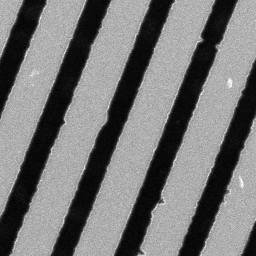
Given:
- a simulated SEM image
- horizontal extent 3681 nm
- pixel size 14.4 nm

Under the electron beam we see parallel lines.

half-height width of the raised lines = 23.4 pixels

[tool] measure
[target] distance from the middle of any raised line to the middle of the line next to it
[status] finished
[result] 0.851 um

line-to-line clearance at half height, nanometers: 515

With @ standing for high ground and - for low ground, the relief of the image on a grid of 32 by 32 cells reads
---@@@-----@@@-----@@@-----@@@--
--@@@-----@@@-----@@@-----@@@---
--@@@-----@@@-----@@@-----@@@---
-@@@@----@@@@----@@@-----@@@----
-@@@-----@@@-----@@@-----@@@----
-@@@-----@@@-----@@@-----@@@----
@@@-----@@@-----@@@-----@@@-----
@@@-----@@@-----@@@-----@@@-----
@@@----@@@@----@@@@----@@@@----@
@@-----@@@-----@@@-----@@@-----@
@@-----@@@-----@@@-----@@@-----@
@-----@@@-----@@@-----@@@-----@@
@-----@@@-----@@@-----@@@-----@@
@----@@@@----@@@@----@@@@----@@@
-----@@@-----@@@-----@@@-----@@@
-----@@@-----@@@-----@@@-----@@@
----@@@@----@@@-----@@@-----@@@-
----@@@-----@@@-----@@@-----@@@-
---@@@@----@@@@----@@@@----@@@@-
---@@@-----@@@-----@@@-----@@@--
---@@@-----@@@-----@@@-----@@@--
--@@@-----@@@-----@@@-----@@@---
--@@@-----@@@-----@@@-----@@@---
-@@@@-----@@@----@@@@----@@@@---
-@@@-----@@@-----@@@-----@@@----
-@@@-----@@@-----@@@-----@@@----
@@@@----@@@-----@@@-----@@@-----
@@@-----@@@-----@@@-----@@@-----
@@@-----@@@----@@@@----@@@@----@
@@-----@@@-----@@@-----@@@-----@
@@-----@@@-----@@@-----@@@-----@
@@----@@@-----@@@@----@@@-----@@